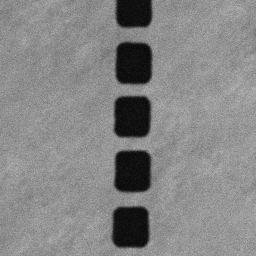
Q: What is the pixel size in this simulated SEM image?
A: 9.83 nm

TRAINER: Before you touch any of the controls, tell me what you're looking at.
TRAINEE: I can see holes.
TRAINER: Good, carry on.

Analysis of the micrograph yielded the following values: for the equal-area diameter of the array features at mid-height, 417 nm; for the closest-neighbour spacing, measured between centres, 532 nm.